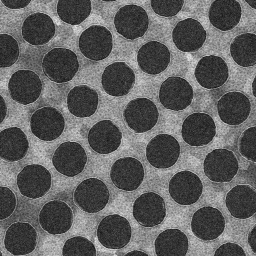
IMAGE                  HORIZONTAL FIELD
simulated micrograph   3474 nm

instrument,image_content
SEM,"a regular array of holes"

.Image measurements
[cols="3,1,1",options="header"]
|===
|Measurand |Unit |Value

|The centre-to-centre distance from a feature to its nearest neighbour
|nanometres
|560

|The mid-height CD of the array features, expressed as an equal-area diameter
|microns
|0.461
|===